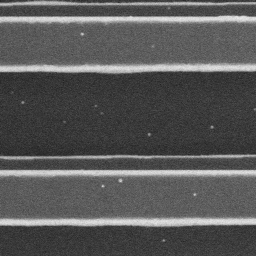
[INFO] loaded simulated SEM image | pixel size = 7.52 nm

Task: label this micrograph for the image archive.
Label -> lines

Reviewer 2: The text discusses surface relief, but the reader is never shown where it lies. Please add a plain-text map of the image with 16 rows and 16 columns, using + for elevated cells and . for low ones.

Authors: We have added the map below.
................
++++++++++++++++
++++++++++++++++
++++++++++++++++
................
................
................
................
................
................
................
++++++++++++++++
++++++++++++++++
++++++++++++++++
................
................